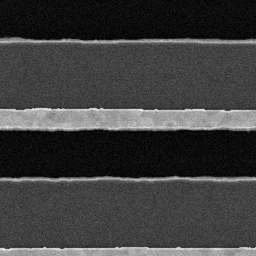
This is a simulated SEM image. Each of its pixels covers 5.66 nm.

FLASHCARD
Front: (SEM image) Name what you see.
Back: lines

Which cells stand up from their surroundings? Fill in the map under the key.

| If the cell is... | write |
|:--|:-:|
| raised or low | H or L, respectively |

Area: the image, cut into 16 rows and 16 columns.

LLLLLLLLLLLLLLLL
LLLLLLLLLLLLLLLL
LLLLLLLLLLLLLLLL
HHHHHHHHHHHHHHHH
HHHHHHHHHHHHHHHH
HHHHHHHHHHHHHHHH
HHHHHHHHHHHHHHHH
HHHHHHHHHHHHHHHH
LLLLLLLLLLLLLLLL
LLLLLLLLLLLLLLLL
LLLLLLLLLLLLLLLL
HHHHHHHHHHHHHHHH
HHHHHHHHHHHHHHHH
HHHHHHHHHHHHHHHH
HHHHHHHHHHHHHHHH
HHHHHHHHHHHHHHHH